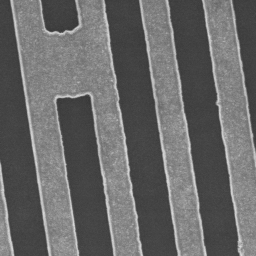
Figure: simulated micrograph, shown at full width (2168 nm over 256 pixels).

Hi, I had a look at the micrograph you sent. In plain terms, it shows one or a few lines or trenches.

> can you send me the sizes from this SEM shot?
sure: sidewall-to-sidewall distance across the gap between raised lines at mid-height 36.5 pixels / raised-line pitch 536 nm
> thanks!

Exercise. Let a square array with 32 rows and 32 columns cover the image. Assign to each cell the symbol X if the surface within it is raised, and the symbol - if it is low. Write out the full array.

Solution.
-XXXX-----XXX-----XXX----XXXX---
--XXX-----XXX-----XXX-----XXX---
--XXX-----XXX-----XXX-----XXX---
--XXXX----XXX-----XXX-----XXX---
--XXXXXXXXXXXX----XXXX----XXXX--
--XXXXXXXXXXXX----XXXX----XXXX--
--XXXXXXXXXXXX-----XXX----XXXX--
---XXXXXXXXXXX-----XXX-----XXX--
---XXXXXXXXXXX-----XXX-----XXX--
---XXXXXXXXXXX-----XXX-----XXX--
---XXXXXXXXXXX-----XXXX----XXXX-
---XXXXXXXXXXXX----XXXX----XXXX-
---XXXX----XXXX----XXXX----XXXX-
---XXXX-----XXX-----XXX----XXXX-
----XXX-----XXX-----XXX-----XXX-
----XXX-----XXX-----XXX-----XXX-
----XXX-----XXX-----XXX-----XXX-
----XXXX----XXXX----XXXX----XXXX
----XXXX----XXXX----XXXX----XXXX
----XXXX----XXXX-----XXX----XXXX
-----XXX-----XXX-----XXX-----XXX
-----XXX-----XXX-----XXX-----XXX
-----XXX-----XXX-----XXX-----XXX
-----XXXX----XXX-----XXX-----XXX
-----XXXX----XXXX----XXXX----XXX
X----XXXX----XXXX----XXXX----XXX
X----XXXX-----XXX-----XXX----XXX
X-----XXX-----XXX-----XXX-----XX
X-----XXX-----XXX-----XXX-----XX
X-----XXX-----XXX-----XXX-----XX
X-----XXXX----XXX-----XXX-----XX
XX----XXXX----XXXX----XXXX----XX